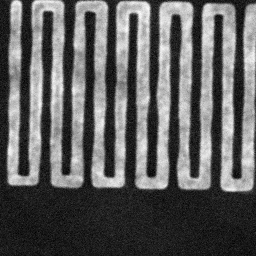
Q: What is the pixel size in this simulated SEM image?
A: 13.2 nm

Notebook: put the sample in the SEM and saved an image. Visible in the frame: groups of lines, slits or small figures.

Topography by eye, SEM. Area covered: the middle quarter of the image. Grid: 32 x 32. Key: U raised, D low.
DDDUUDDDUUDDDUUUDDUUUDDDUUDDDUUU
DDDUUDDDUUDDDUUUDDUUUDDDUUDDDUUU
DDUUUDDDUUDDDUUUDDUUUDDDUUDDDUUU
DDUUUDDDUUDDDUUUDDUUUDDDUUDDDUUU
DDUUUDDDUUDDDUUUDDUUUDDDUUDDDUUU
DDUUUDDDUUDDDUUUDDUUUDDDUUDDDUUU
DDUUUDDDUUDDDUUUDDUUUDDDUUDDDUUU
DDUUUDDDUUDDDUUUDDUUUDDDUUDDDUUU
DDUUUDDDUUDDDUUUDDUUUDDDUUDDDUUU
DDUUUDDDUUDDDUUDDDUUUDDDUUDDDUUU
DDUUUDDDUUDDDUUDDDUUUDDDUUDDDUUU
DDUUUDDDUUDDDUUDDDUUUDDDUUDDDUUU
DDUUUDDDUUDDDUUDDDDUUDDDUUDDDUUD
DDUUUDDDUUDDDUUDDDUUDDDDUUDDDUUD
DDUUUDDDUUDDDUUDDDUUDDDDUUDDDUUD
DDUUUDDDUUDDDUUDDDUUDDDDUUDDDUUD
DDUUUDDDUUDDDUUDDDUUDDDDUUDDDUUD
DDUUUDDDUUDDDUUDDDUUDDDDUUDDDUUD
DDUUUDDDUUDDDUUDDDUUDDDDUUDDDUUD
DDUUUDDDUUDDDUUDDDUUUDDDUUDDDUUD
DDUUUDDDUUDDDUUDDDUUUDDDUUDDDUUD
DDUUUDDUUUDDDUUDDDUUUDDDUUDDDUUD
DDUUUDDUUUDDDUUDDDUUDDDDUUDDDUUD
DDUUUDDUUUDDDUUDDDUUDDDDUUDDDUUD
DDUUUDDUUUDDDUUDDDUUDDDDUUDDDUUD
DDUUUDDUUUDDDUUDDDUUDDDUUUDDUUUD
DDUUUDDUUUDDDUUDDDUUDDDUUUDDUUUD
DDUUUDDUUUDDDUUDDDUUDDDUUUDDDUUD
UUUUUDDUUUUDUUUDDDUUUDUUUUDDDUUU
UUUUUDDUUUUUUUUDDDUUUUUUUUDDDUUU
UUUUDDDDUUUUUUUDDDUUUUUUUUDDDUUU
DDDDDDDDDDDDDDDDDDDDDDDDDDDDDDDD